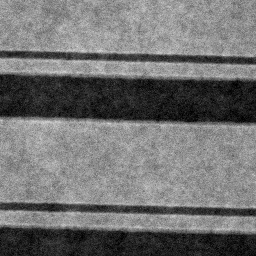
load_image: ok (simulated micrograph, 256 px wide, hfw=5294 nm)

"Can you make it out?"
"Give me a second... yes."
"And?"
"lines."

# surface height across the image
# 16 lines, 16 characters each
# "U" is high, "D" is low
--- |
UUUUUUUUUUUUUUUU
UUUUUUUUUUUUUUUU
UUUUUUUUUUUUUUUU
UUUUUUUUUUUUUUUU
UUUUUUUUUUUUUUUU
DDDDDDDDDDDDDDDD
DDDDDDDDDDDDDDDD
UDDDDDDDDDDDDDDD
UUUUUUUUUUUUUUUU
UUUUUUUUUUUUUUUU
UUUUUUUUUUUUUUUU
UUUUUUUUUUUUUUUU
UUUUUUUUUUUUUUUU
UUUUUUUUUUUUUUUU
DDDDDDDDDDDDDDDD
DDDDDDDDDDDDDDDD